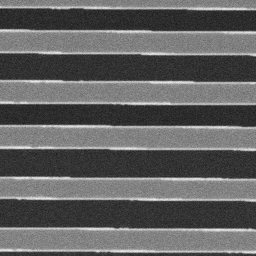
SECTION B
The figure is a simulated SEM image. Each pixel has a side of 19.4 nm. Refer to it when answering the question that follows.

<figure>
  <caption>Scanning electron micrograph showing lines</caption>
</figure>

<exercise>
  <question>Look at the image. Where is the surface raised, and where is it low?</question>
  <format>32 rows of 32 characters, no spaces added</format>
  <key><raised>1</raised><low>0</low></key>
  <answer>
11111111111111111111111111111111
00000000000000000000000000000000
00000000000000000000000000000000
00000000000000000000000000000000
11111111111111111111111111111111
11111111111111111111111111111111
11111111111111111111111111111111
00000000000000000000000000000000
00000000000000000000000000000000
00000000000000000000000000000000
11111111111111111111111111111111
11111111111111111111111111111111
11111111111111111111111111111111
00000000000000000000000000000000
00000000000000000000000000000000
00000000000000000000000000000000
11111111111111111111111111111111
11111111111111111111111111111111
11111111111111111111111111111111
00000000000000000000000000000000
00000000000000000000000000000000
00000000000000000000000000000000
11111111111111111111111111111111
11111111111111111111111111111111
11111111111111111111111111111111
00000000000000000000000000000000
00000000000000000000000000000000
00000000000000000000000000000000
00000000000000000000000000000000
11111111111111111111111111111111
11111111111111111111111111111111
00000000000000000000000000000011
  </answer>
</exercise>